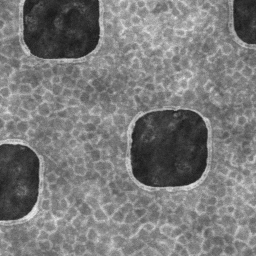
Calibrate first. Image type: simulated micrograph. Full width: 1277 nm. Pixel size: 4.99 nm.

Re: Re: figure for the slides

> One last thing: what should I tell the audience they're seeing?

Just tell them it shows holes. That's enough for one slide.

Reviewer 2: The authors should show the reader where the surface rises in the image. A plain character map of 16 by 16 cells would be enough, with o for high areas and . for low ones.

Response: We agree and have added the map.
o.....ooooooooo.
o.....ooooooooo.
oo....ooooooooo.
oo...ooooooooooo
oooooooooooooooo
oooooooooooooooo
oooooooooooooooo
ooooooooo....ooo
oooooooo.....ooo
..oooooo.....ooo
...ooooo.....ooo
..ooooooo...oooo
..oooooooooooooo
..oooooooooooooo
oooooooooooooooo
oooooooooooooooo